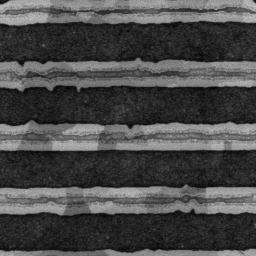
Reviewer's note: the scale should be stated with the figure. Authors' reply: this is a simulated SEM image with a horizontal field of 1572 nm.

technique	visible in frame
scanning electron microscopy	one or a few lines or trenches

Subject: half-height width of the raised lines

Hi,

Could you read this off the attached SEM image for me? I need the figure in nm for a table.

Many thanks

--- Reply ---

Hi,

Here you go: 123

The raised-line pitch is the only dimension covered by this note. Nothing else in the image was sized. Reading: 387 nanometres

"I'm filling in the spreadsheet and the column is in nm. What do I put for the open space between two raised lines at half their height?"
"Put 263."